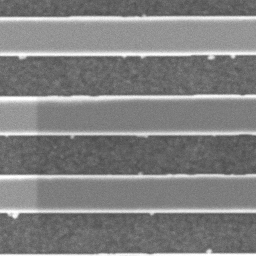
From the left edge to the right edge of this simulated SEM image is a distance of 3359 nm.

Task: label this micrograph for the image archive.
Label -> lines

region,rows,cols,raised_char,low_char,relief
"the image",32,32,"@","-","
--------------------------------
--------------------------------
@@@@@@@@@@@@@@@@@@@@@@@@@@@@@@@@
@@@@@@@@@@@@@@@@@@@@@@@@@@@@@@@@
@@@@@@@@@@@@@@@@@@@@@@@@@@@@@@@@
@@@@@@@@@@@@@@@@@@@@@@@@@@@@@@@@
@@@@@@@@@@@@@@@@@@@@@@@@@@@@@@@@
--------------------------------
--------------------------------
--------------------------------
--------------------------------
--------------------------------
@@@@@@@@@@@@@@@@@@@@@@@@@@@@@@@@
@@@@@@@@@@@@@@@@@@@@@@@@@@@@@@@@
@@@@@@@@@@@@@@@@@@@@@@@@@@@@@@@@
@@@@@@@@@@@@@@@@@@@@@@@@@@@@@@@@
@@@@@@@@@@@@@@@@@@@@@@@@@@@@@@@@
--------------------------------
--------------------------------
--------------------------------
--------------------------------
--------------------------------
@@@@@@@@@@@@@@@@@@@@@@@@@@@@@@@@
@@@@@@@@@@@@@@@@@@@@@@@@@@@@@@@@
@@@@@@@@@@@@@@@@@@@@@@@@@@@@@@@@
@@@@@@@@@@@@@@@@@@@@@@@@@@@@@@@@
@@@@@@@@@@@@@@@@@@@@@@@@@@@@@@@-
--------------------------------
--------------------------------
--------------------------------
--------------------------------
--------------------------------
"